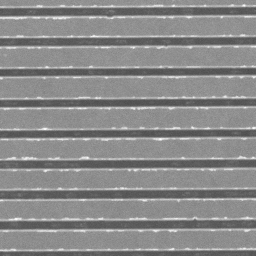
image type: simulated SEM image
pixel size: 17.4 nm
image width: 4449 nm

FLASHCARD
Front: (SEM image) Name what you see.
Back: parallel lines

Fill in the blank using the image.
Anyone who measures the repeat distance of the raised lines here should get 530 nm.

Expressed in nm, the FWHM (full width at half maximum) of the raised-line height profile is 365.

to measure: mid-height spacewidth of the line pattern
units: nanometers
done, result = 156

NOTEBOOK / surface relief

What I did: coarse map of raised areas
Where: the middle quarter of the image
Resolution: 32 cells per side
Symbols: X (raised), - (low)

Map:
XXXXXXXXXXXXXXXXXXXXXXXXXXXXXXXX
--------------------------------
--------------------------------
XXXXXXXXXXXXXXXXXXXXXXXXXXXXXXXX
XXXXXXXXXXXXXXXXXXXXXXXXXXXXXXXX
XXXXXXXXXXXXXXXXXXXXXXXXXXXXXXXX
XXXXXXXXXXXXXXXXXXXXXXXXXXXXXXXX
XXXXXXXXXXXXXXXXXXXXXXXXXXXXXXXX
XXXXXXXXXXXXXXXXXXXXXX----------
--------------------------------
--------------------------------
XXXXXXXXXXXXXXXXXXXXXXXXXXXXXXXX
XXXXXXXXXXXXXXXXXXXXXXXXXXXXXXXX
XXXXXXXXXXXXXXXXXXXXXXXXXXXXXXXX
XXXXXXXXXXXXXXXXXXXXXXXXXXXXXXXX
XXXXXXXXXXXXXXXXXXXXXXXXXXXXXXXX
--------------------------------
--------------------------------
-----------------------XXXXXXXXX
XXXXXXXXXXXXXXXXXXXXXXXXXXXXXXXX
XXXXXXXXXXXXXXXXXXXXXXXXXXXXXXXX
XXXXXXXXXXXXXXXXXXXXXXXXXXXXXXXX
XXXXXXXXXXXXXXXXXXXXXXXXXXXXXXXX
XXXXXXXXXXXXXXXXXXXXXXXXXXXXXXXX
--------------------------------
--------------------------------
XXXXXXXXXXXXXXXXXXXXXXXXXXXXXXXX
XXXXXXXXXXXXXXXXXXXXXXXXXXXXXXXX
XXXXXXXXXXXXXXXXXXXXXXXXXXXXXXXX
XXXXXXXXXXXXXXXXXXXXXXXXXXXXXXXX
XXXXXXXXXXXXXXXXXXXXXXXXXXXXXXXX
--------------------------------